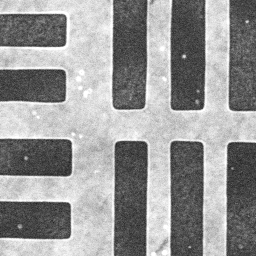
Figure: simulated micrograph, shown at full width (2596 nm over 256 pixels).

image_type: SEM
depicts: groups of lines, slits or small figures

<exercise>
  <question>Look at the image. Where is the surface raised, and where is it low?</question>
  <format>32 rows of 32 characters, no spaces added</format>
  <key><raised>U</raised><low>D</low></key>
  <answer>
UUUUUUUUUUUUUUDDDDUUUDDDDDUUUDDD
UUUUUUUUUUUUUUDDDDUUUDDDDDUUUDDD
DDDDDDDDUUUUUUDDDDUUUDDDDDUUUDDD
DDDDDDDDUUUUUUDDDDUUUDDDDDUUUDDD
DDDDDDDDUUUUUUDDDDUUUDDDDDUUUDDD
DDDDDDDDUUUUUUDDDDUUUDDDDDUUUDDD
UUUUUUUUUUUUUUDDDDUUUDDDDDUUUDDD
UUUUUUUUUUUUUUDDDDUUUDDDDDUUUDDD
UUUUDDDUUUUUUUDDDDUUUDDDDDUUUDDD
DDDDDDDDUUUUUUDDDDUUUDDDDDUUUDDD
DDDDDDDDUUUUUUDDDDUUUDDDDDUUUDDD
DDDDDDDDUUUUUUDDDDUUUDDDDDUUUDDD
DDDDDDDDUUUUUUDDDDUUUDDDDDUUDDDD
UUUUUUUUUUUUUUDDDDUUUDDDDUUUUDDD
UUUUUUUUUUUUUUUUUUUUUUUUUUUUUUUU
UUUUUUUUUUUUUUUUUUUUUUUUUUUUUUUU
UUUUUUUUUUUUUUUUUUUUUUUUUUUUUUUU
DDDDDDDDDUUUUUUDDUUUUUDUUUUUUUUU
DDDDDDDDDUUUUUDDDDUUUDDDDUUUDDDD
DDDDDDDDDUUUUUDDDDDUUDDDDDUUDDDD
DDDDDDDDDUUUUUDDDDDUUDDDDDUUDDDD
DDDDDDDDDUUUUUDDDDDUUDDDDDUUDDDD
UUUUUUUUUUUUUUDDDDUUUDDDDDUUDDDD
UUUUUUUUUUUUUUDDDDUUUDDDDDUUDDDD
UUUUUUUUUUUUUUDDDDUUUDDDDUUUDDDD
DDDDDDDDDUUUUUDDDDUUUDDDDUUUDDDD
DDDDDDDDDUUUUUDDDDUUUDDDDUUUDDDD
DDDDDDDDDUUUUUDDDDUUUDDDDUUUDDDD
DDDDDDDDDUUUUUDDDDUUUDDDDUUUDDDD
DDDDDDDDDUUUUUDDDDUUUDDDDUUUDDDD
UUUUUUUUUUUUUUDDDDUUUDDDDUUUDDDD
UUUUUUUUUUUUUUDDDDUUUDDDDUUUDDDD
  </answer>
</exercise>